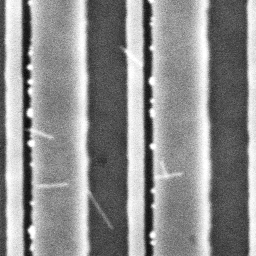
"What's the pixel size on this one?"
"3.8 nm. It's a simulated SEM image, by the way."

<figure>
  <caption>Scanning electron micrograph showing lines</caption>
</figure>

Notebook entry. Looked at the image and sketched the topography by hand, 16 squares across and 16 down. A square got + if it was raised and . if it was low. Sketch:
+++++...+++++...
+++++...+++++...
+++++...+++++...
+++++...+++++...
+++++...+++++...
+++++...+++++...
+++++...+++++...
+++++...+++++...
+++++...+++++...
+++++...+++++...
+++++...+++++...
+++++...+++++...
+++++...+++++...
+++++...+++++...
+++++...+++++...
+++++...+++++...